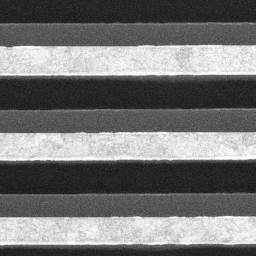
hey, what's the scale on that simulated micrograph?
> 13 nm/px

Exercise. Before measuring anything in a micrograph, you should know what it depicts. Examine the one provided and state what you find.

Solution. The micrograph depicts lines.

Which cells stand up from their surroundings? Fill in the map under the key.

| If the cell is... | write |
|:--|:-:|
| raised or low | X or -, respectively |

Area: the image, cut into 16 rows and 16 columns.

----------------
XXXXXXXXXXXXXXXX
XXXXXXXXXXXXXXXX
XXXXXXXXXXXXXXXX
XXXXXXXXXXXXXXXX
----------------
----------------
XXXXXXXXXXXXXXXX
XXXXXXXXXXXXXXXX
XXXXXXXXXXXXXXXX
----------------
----------------
XXXXXXXXXXXXXXXX
XXXXXXXXXXXXXXXX
XXXXXXXXXXXXXXXX
----------------